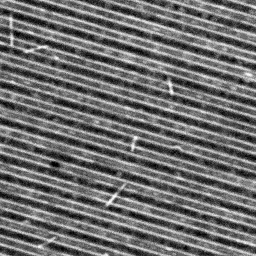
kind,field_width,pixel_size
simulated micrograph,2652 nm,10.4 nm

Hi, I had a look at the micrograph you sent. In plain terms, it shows parallel lines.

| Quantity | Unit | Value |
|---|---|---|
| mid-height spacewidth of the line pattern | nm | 65.9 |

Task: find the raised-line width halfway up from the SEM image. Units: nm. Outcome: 116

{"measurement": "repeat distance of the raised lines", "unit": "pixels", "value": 17.6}